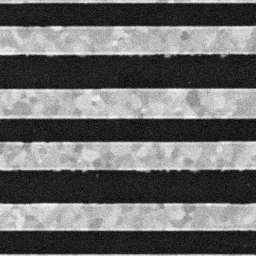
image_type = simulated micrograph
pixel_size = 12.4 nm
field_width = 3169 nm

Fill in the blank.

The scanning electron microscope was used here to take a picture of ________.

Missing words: lines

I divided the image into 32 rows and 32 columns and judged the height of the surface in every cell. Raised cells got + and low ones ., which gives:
................................
................................
................................
++++++++++++++++++++++++++++++++
++++++++++++++++++++++++++++++++
++++++++++++++++++++++++++++++++
++++++++++++++++++++++++++++++++
................................
................................
................................
................................
++++++++++++++++++++++++++++++++
++++++++++++++++++++++++++++++++
++++++++++++++++++++++++++++++++
++++++++++++++++++++++++++++++++
................................
................................
................................
++++++++++++++++++++++++++++++++
++++++++++++++++++++++++++++++++
++++++++++++++++++++++++++++++++
................................
................................
................................
................................
................................
++++++++++++++++++++++++++++++++
++++++++++++++++++++++++++++++++
++++++++++++++++++++++++++++++++
................................
................................
................................